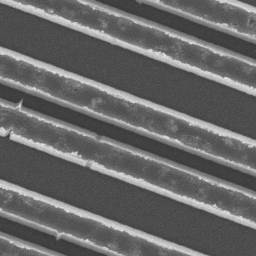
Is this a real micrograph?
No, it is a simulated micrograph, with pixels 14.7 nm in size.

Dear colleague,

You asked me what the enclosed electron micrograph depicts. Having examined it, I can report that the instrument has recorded parallel lines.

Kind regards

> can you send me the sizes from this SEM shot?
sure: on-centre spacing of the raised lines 0.915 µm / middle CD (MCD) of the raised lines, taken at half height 0.415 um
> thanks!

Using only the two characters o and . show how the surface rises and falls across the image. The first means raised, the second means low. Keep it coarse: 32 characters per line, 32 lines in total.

..oooooooooo.......ooooooooooo..
....oooooooooo........oooooooooo
.......oooooooooo........ooooooo
..........oooooooooo........oooo
.............oooooooooo.......oo
...............oooooooooo.......
o.................oooooooooo....
oooo.................oooooooooo.
oooooo..................oooooooo
ooooooooo.................oooooo
.ooooooooooo.................ooo
....oooooooooo..................
.......oooooooooo...............
ooo.......oooooooooo............
ooooo.......ooooooooooo.........
oooooooo.......oooooooooo.......
oooooooooo........oooooooooo....
...oooooooooo........oooooooooo.
.....ooooooooooo.......ooooooooo
........ooooooooooo.......oooooo
...........oooooooooo........ooo
..............oooooooooo........
................ooooooooooo.....
oo.................oooooooooo...
ooooo.................oooooooooo
ooooooo.................oooooooo
oooooooooo.................ooooo
...oooooooooo.................oo
.....oooooooooo.................
........oooooooooo..............
ooo........oooooooooo...........
oooooo........oooooooooo........